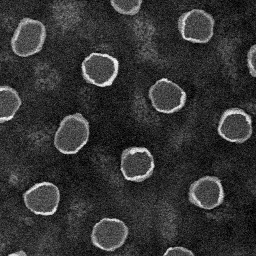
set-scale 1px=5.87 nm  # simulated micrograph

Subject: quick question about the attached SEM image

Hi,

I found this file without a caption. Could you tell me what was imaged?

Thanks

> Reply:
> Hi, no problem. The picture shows a regular array of raised bodies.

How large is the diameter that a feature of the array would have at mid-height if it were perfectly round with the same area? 199 nanometers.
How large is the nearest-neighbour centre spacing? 423 nanometers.